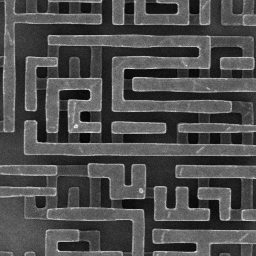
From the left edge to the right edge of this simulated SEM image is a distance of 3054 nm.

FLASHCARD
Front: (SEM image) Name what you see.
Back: wiring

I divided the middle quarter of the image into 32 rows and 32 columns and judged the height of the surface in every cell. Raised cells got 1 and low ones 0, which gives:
00000000000011111111111111111111
00000000000011100000000000000000
00000000000011100000000000000000
00000001100011100111111100001111
11111111100011100111111111111111
11111111100011100111111111111111
00000011100011100111111111111111
00000001100011100000000000000000
00000001100011100000000000000000
01111111100011111111111111111111
01111111100011111111111111111111
01111111100011111111111111111111
01110000000000000000000000000000
01110000000000000000000000000000
01111000000011100000000000000000
01111111100011111111111110000111
01111111100011111111111110000111
00000000000000000000000000000000
00000000000000000000000000000000
00000000000000000000000000000000
11111111111111111111111111111111
11111111111111111111111111111111
11111111111111111111111111111111
00000000000000000000000000000000
00000000000000000000000000000000
00000011111111100111000000001111
00000011111111100111000000001111
00000011111111100111000000001111
00000000000111100111000000000000
00000000000011100111000000000000
00000000000011111111000000000000
00000000000011111111000111001110